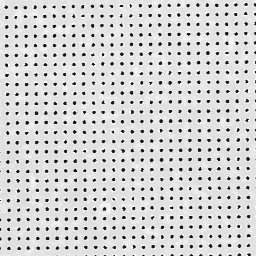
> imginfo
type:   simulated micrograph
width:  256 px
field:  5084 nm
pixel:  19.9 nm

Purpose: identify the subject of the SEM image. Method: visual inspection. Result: a regular array of holes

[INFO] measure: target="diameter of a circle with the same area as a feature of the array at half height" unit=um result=0.0743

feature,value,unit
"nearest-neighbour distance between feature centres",186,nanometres